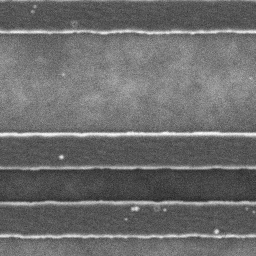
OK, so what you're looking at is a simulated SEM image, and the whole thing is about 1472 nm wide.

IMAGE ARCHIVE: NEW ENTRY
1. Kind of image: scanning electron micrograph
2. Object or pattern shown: lines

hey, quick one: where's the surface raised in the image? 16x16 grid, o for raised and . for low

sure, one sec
oooooooooooooooo
oooooooooooooooo
................
................
................
................
................
................
oooooooooooooooo
oooooooooooooooo
oooooooooo.ooooo
................
................
oooooooooooooooo
oooooooooooooooo
................